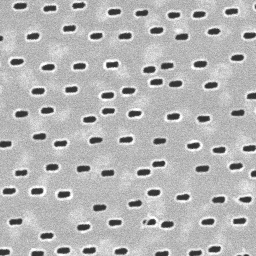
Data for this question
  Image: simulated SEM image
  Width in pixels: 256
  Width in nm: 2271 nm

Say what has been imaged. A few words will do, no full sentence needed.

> a regular array of holes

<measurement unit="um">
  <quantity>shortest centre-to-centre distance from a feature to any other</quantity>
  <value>0.209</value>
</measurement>